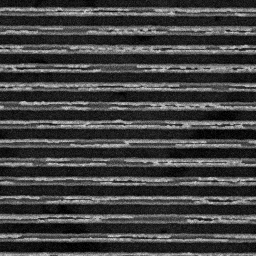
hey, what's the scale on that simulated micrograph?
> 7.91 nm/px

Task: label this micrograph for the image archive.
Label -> parallel lines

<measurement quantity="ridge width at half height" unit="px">7.75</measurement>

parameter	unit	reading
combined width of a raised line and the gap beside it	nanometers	149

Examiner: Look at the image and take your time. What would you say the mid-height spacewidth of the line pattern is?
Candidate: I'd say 0.0889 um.